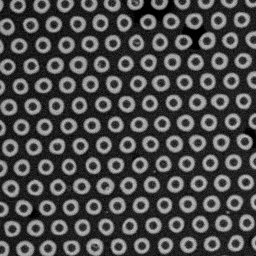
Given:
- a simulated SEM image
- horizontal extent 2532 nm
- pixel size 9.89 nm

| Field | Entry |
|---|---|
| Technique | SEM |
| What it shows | an array of small figures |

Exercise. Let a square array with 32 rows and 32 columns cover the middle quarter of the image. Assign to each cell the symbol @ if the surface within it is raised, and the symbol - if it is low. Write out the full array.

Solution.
-@@@@@--@@@---@@@--@@@@--@@@@--@
--@@@---@@@---@@----@@----@@----
--------------------------------
@@---@@@---@@@---@@@---@@@--@@@@
@@@--@@@@--@@@---@@@@-@@@@--@@@@
@@@--@@@@--@@@---@@@--@@@@---@@@
@@---@@@---@@@---@@----@@-------
--------------------------------
---@@----@@---@@@---@@@---@@@---
--@@@---@@@@--@@@@--@@@---@@@--@
--@@@@--@@@@--@@@@--@@@---@@@--@
--@@@@--@@@---@@@---@@@----@----
--------------------------------
------------@@----@@---@@@---@@@
@@@--@@@@--@@@@--@@@@--@@@--@@@@
@@@--@@@@--@@@@--@@@@--@@@--@@@@
@@@--@@@@---@@---@@@---@@@----@@
--------------------------------
---------@@----@@---@@@---@@@--@
--@@@@--@@@@--@@@@--@@@@--@@@@-@
--@@@@--@@@@--@@@@--@@@@--@@@@--
--@@@@--@@@@--@@@---@@@---@@@---
--------------------------------
-------@----------@@----@@---@@@
@@@---@@@--@@@@--@@@@--@@@@--@@@
@@@---@@@--@@@@--@@@@--@@@@--@@@
@@@---@@@--@@@@--@@@@---@@----@@
-@------------------------------
---------------@@----@@----@@---
---@@@--@@@@--@@@@--@@@@--@@@@--
--@@@@@-@@@@--@@@@--@@@@--@@@@--
---@@@--@@@@--@@@@--@@@---@@@---